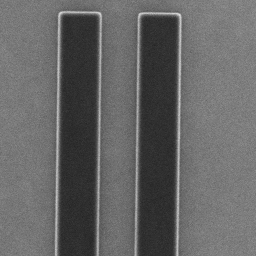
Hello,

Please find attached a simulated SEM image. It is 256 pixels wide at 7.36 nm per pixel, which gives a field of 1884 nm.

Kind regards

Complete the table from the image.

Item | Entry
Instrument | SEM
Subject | groups of lines, slits or small figures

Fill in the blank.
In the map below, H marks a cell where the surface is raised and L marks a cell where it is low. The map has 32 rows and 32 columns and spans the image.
LLLLLLLLLLLLLLLLLLLLLLLLLLLLLLLL
LLLLLLLLHHHLLLLLLLLLLLLLLLLLLLLL
LLLLLLLHHHHHHLLLLHHHHHHLLLLLLLLL
LLLLLLLHHHHHHLLLLHHHHHHLLLLLLLLL
LLLLLLLHHHHHHLLLLHHHHHLLLLLLLLLL
LLLLLLLHHHHHHLLLLHHHHHLLLLLLLLLL
LLLLLLLHHHHHHLLLLHHHHHLLLLLLLLLL
LLLLLLLHHHHHHLLLLHHHHHLLLLLLLLLL
LLLLLLLHHHHHHLLLLHHHHHLLLLLLLLLL
LLLLLLLHHHHHHLLLLHHHHHLLLLLLLLLL
LLLLLLLHHHHHLLLLLHHHHHLLLLLLLLLL
LLLLLLLHHHHHLLLLLHHHHHLLLLLLLLLL
LLLLLLLHHHHHLLLLLHHHHHLLLLLLLLLL
LLLLLLLHHHHHLLLLLHHHHHLLLLLLLLLL
LLLLLLLHHHHHLLLLLHHHHHLLLLLLLLLL
LLLLLLLHHHHHLLLLLHHHHHLLLLLLLLLL
LLLLLLLHHHHHLLLLLHHHHHLLLLLLLLLL
LLLLLLLHHHHHLLLLLHHHHHLLLLLLLLLL
LLLLLLLHHHHHLLLLLHHHHHLLLLLLLLLL
LLLLLLLHHHHHLLLLLHHHHHLLLLLLLLLL
LLLLLLLHHHHHLLLLLHHHHHLLLLLLLLLL
LLLLLLLHHHHHLLLLLHHHHHLLLLLLLLLL
LLLLLLLHHHHHLLLLLHHHHHLLLLLLLLLL
LLLLLLLHHHHHLLLLLHHHHHLLLLLLLLLL
LLLLLLLHHHHHLLLLLHHHHHLLLLLLLLLL
LLLLLLLHHHHHLLLLLHHHHHLLLLLLLLLL
LLLLLLLHHHHHLLLLLHHHHHLLLLLLLLLL
LLLLLLLHHHHHLLLLLHHHHHLLLLLLLLLL
LLLLLLLHHHHHLLLLLHHHHHLLLLLLLLLL
LLLLLLLHHHHHLLLLLHHHHHLLLLLLLLLL
LLLLLLLHHHHHLLLLLHHHHHLLLLLLLLLL
LLLLLLLHHHHHLLLLLHHHHHLLLLLLLLLL